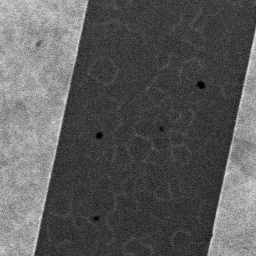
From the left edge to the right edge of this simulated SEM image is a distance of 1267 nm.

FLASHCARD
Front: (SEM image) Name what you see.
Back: one or a few lines or trenches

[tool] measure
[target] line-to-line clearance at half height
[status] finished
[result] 842 nanometers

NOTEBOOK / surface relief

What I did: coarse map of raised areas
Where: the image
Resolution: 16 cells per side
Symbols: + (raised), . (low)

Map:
+++++...........
+++++...........
+++++...........
+++++...........
+++++..........+
++++...........+
++++...........+
++++...........+
++++...........+
+++...........++
+++...........++
+++...........++
+++...........++
+++...........++
++...........+++
++...........+++